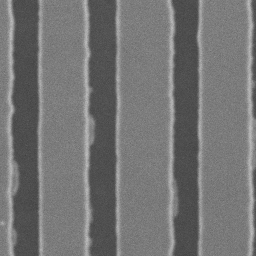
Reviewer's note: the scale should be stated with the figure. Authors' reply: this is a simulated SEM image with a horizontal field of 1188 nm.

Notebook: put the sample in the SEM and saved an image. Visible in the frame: lines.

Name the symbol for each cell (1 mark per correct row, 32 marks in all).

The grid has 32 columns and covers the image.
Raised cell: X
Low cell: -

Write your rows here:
X----XXXXXX----XXXXXX----XXXXXX-
X----XXXXXX----XXXXXXX---XXXXXX-
XX---XXXXXX----XXXXXXX---XXXXXX-
XX---XXXXXX----XXXXXXX---XXXXXXX
XX---XXXXXX----XXXXXXX---XXXXXX-
XX---XXXXXX----XXXXXXX---XXXXXX-
XX---XXXXXX----XXXXXXX---XXXXXX-
XX---XXXXXX----XXXXXXX---XXXXXX-
XX---XXXXXX----XXXXXXX---XXXXXX-
XX---XXXXXX----XXXXXXX---XXXXXX-
XX---XXXXXX----XXXXXXX---XXXXXX-
X----XXXXXX----XXXXXXX---XXXXXX-
X----XXXXXX----XXXXXXX---XXXXXX-
XX---XXXXXX----XXXXXXX---XXXXXX-
X----XXXXXX----XXXXXXX---XXXXXX-
X----XXXXXX----XXXXXXX---XXXXXX-
X----XXXXXX----XXXXXXX---XXXXXX-
X----XXXXXX----XXXXXXX---XXXXXX-
XX---XXXXXX----XXXXXXX---XXXXXXX
X----XXXXXX----XXXXXXX---XXXXXX-
XX---XXXXXX----XXXXXXX---XXXXXX-
XX---XXXXXX----XXXXXXX---XXXXXX-
X----XXXXXX----XXXXXXX---XXXXXX-
X----XXXXXX----XXXXXXX---XXXXXXX
X----XXXXXX----XXXXXXX---XXXXXXX
X----XXXXXX----XXXXXXX---XXXXXXX
XX---XXXXXX----XXXXXXX---XXXXXXX
XX---XXXXXX----XXXXXXX---XXXXXXX
X----XXXXXX----XXXXXXX---XXXXXXX
X----XXXXXX----XXXXXXX---XXXXXXX
X----XXXXXX----XXXXXXX---XXXXXXX
XX---XXXXXX----XXXXXXX---XXXXXX-